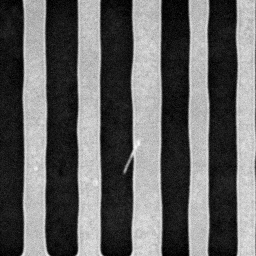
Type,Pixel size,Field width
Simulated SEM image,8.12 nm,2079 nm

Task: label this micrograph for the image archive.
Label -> groups of lines, slits or small figures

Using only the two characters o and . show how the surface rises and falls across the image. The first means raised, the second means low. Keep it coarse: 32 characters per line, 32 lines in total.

...ooo....oo.....ooo....oo....oo
...ooo....oo.....ooo....oo....oo
...ooo....oo.....ooo....oo....oo
...ooo....oo.....ooo....oo....oo
...ooo....oo.....ooo....oo....oo
...ooo....oo.....ooo....oo....oo
...ooo....oo.....ooo....oo....oo
...ooo....oo.....ooo....oo....oo
...ooo....oo.....ooo....oo....oo
...ooo....oo.....ooo....oo....oo
...ooo....oo.....ooo....oo....oo
...ooo....oo.....ooo....oo....oo
...ooo....oo.....ooo....oo....oo
...ooo....oo.....ooo....oo....oo
...ooo....oo.....ooo....oo....oo
...ooo....oo.....ooo....oo....oo
...ooo....oo.....ooo....oo....oo
...ooo....oo.....ooo....oo....oo
...ooo....oo.....ooo....oo....oo
...ooo....oo.....ooo....oo....oo
...ooo....oo.....ooo....oo....oo
...ooo....ooo....ooo....oo....oo
...ooo....ooo....ooo....oo....oo
...ooo....ooo....ooo....oo....oo
...ooo....ooo....ooo....oo....oo
...ooo....oo.....ooo....oo....oo
...ooo....oo.....ooo....oo....oo
...ooo....oo.....ooo....oo....oo
...ooo....oo.....ooo....oo....oo
...ooo....oo.....ooo....oo....oo
...ooo....oo.....ooo....oo....oo
...ooo....ooo....ooo....oo....oo